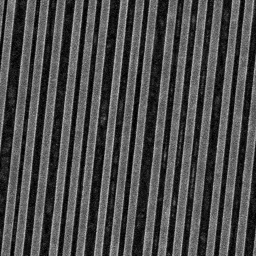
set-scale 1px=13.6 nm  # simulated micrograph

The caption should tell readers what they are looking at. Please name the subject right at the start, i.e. parallel lines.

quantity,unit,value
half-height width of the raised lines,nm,103